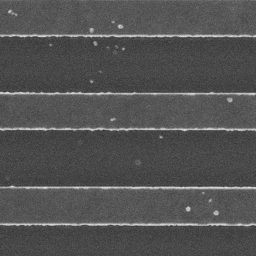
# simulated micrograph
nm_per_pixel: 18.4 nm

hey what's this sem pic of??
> lines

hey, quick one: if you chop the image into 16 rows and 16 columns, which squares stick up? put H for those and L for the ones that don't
HHHHHHHHHHHHHHHH
HHHHHHHHHHHHHHHH
LLLLLLLLLLLLLLLL
LLLLLLLLLLLLLLLL
LLLLLLLLLLLLLLLL
LLLLLLLLLLLLLLLL
HHHHHHHHHHHHHHHH
HHHHHHHHHHHHHHHH
LLLLLLLLLLLLLLLL
LLLLLLLLLLLLLLLL
LLLLLLLLLLLLLLLL
LLLLLLLLLLLLLLLL
HHHHHHHHHHHHHHHH
HHHHHHHHHHHHHHHH
LLLLLLLLLLLLLLLL
LLLLLLLLLLLLLLLL